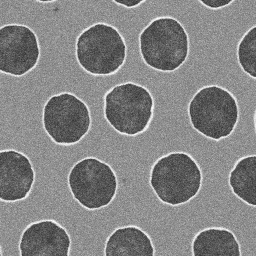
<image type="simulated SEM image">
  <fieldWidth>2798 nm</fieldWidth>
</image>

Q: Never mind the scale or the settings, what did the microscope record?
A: holes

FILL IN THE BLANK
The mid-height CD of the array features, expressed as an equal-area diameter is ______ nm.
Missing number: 537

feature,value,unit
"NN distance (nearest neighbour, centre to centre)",696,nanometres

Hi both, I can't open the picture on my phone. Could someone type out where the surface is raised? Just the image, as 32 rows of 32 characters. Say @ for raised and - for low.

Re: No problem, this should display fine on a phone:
@@@@@@@@@@@@@@@--@@@@@@@@@--@@@@
@@@@@@@@@@@@@@@@@@@@@@@@@@@@@@@@
@@@@@@@@@@@@@@@@@@@@--@@@@@@@@@@
---@@@@@@@@---@@@@-----@@@@@@@@@
----@@@@@@-----@@@-----@@@@@@@@-
-----@@@@@------@@------@@@@@@--
-----@@@@@------@@-----@@@@@@@--
-----@@@@@-----@@@-----@@@@@@@--
----@@@@@@@----@@@@---@@@@@@@@--
@@@@@@@@@@@@@@@@@@@@@@@@@@@@@@@@
@@@@@@@@@@@@@@@@-@@@@@@@@@@@@@@@
@@@@@@@@@@@@@@----@@@@@@@---@@@@
@@@@@@----@@@------@@@@@-----@@@
@@@@@@-----@@------@@@@@------@@
@@@@@@-----@@------@@@@@------@@
@@@@@@-----@@@----@@@@@@-----@@@
@@@@@@-----@@@@---@@@@@@@----@@@
@@@@@@@---@@@@@@@@@@@@@@@@@@@@@@
@@@@@@@@@@@@@@@@@@@@@@@@@@@@@@@@
---@@@@@@@@@@@@@@@@@@--@@@@@@@@@
----@@@@@@---@@@@@@-----@@@@@@--
----@@@@@-----@@@@@------@@@@---
----@@@@@------@@@@------@@@@---
----@@@@@------@@@@------@@@@---
---@@@@@@-----@@@@@@----@@@@@@--
@@@@@@@@@@---@@@@@@@@@@@@@@@@@@-
@@@@@@@@@@@@@@@@@@@@@@@@@@@@@@@@
@@@@@@@@@@@@@@@@@@@@@@@@@@@@@@@@
@@@@----@@@@@@@@-@@@@@@@@@@@@@@@
@@@------@@@@@----@@@@@@@----@@@
@@@------@@@@------@@@@@------@@
@@@-----@@@@@------@@@@@------@@